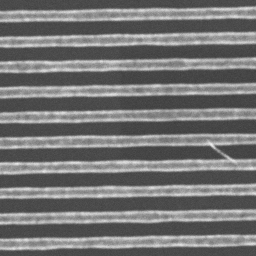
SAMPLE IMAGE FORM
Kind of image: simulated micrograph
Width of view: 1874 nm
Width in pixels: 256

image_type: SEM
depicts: wiring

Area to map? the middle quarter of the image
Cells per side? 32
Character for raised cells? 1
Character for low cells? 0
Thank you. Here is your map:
11111111111111111111111111111111
11111111111000000000000000000000
00000000000000000000000000000000
00000000000000000000000000000000
00000000000000000000000000000000
00000000000000000000000000111111
11111111111111111111111111111111
11111111111111111111111100000000
00000000000000000000000000000000
00000000000000000000000000000000
00000000000000000000000000000000
00000000000000000000000000000000
11111111111111111111111111111111
11111111111111111111111111111111
00000000000000000000000000000000
00000000000000000000000000000000
00000000000000000000000000000000
00000000000000000000000000000000
11111111111111111111111111111111
11111111111111111111111111111111
11111111100000000000000000000000
00000000000000000000000000000000
00000000000000000000000000000000
00000000000000000000000000000000
00000000000000000000000001111111
11111111111111111111111111111111
11111111111111110000000000000000
00000000000000000000000000000000
00000000000000000000000000000000
00000000000000000000000000000000
00000000000000000000000000000000
11111111111111111111111111111111